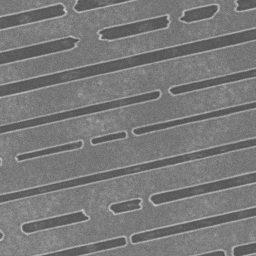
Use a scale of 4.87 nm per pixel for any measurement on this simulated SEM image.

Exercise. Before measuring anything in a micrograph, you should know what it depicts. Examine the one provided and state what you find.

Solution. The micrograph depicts parallel lines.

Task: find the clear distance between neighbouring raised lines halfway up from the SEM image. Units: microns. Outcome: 0.0434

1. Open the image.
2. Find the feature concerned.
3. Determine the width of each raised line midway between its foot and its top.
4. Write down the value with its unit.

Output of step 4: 120 nanometers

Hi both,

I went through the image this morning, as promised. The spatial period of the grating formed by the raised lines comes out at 167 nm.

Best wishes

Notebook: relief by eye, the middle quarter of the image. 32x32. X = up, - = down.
XXXXXX-------------XXXXXXXXXXXXX
X--------------XXXXXXXXXXXXXXXXX
----------XXXXXXXXXXXXXXXXXXXXXX
------XXXXXXXXXXXXXXXXXXXXXXXXXX
--XXXXXXXXXXXXXXXXXXXXXXXXXXXXXX
XXXXXXXXXXXXXXXXXXXXXXXXXXXX----
XXXXXXXXXXXXXXXXXXXXXXXXXX------
XXXXXXXXXXXXXXXXXXX-----XXX---XX
XXXXXXXXXXXXXXX---------XXXXXXXX
XXXXXXXXXX----------XXXXXXXXXXXX
XXXXXX---------XXXXXXXXXXXXXXXXX
X----------XXXXXXXXXXXXXXXXXXXXX
-------XXXXXXXXXXXXXXXXXXXXXXXXX
--XXXXXXXXXXXXXXXXXXXXXXXXXXXX--
XXXXXXXXXXXXXXXXXXXXXXXXX-------
XXXXXXXXXXXXXXXXXXXX--------XXXX
XXXXXXXXXXXXXXXXX--------XXXXXXX
XXXXXXXXXXX-----XX--XXXXXXXXXXXX
XXXXXXX--------XXXXXXXXXXXXXXXXX
XX---XX----XXXXXXXXXXXXXXXXXXXXX
-----XXXXXXXXXXXXXXXXXXXXXXXXXXX
--XXXXXXXXXXXXXXXXXXXXXXXXXXXXXX
XXXXXXXXXXXXXXXXXXXXXXXXXXXXXX--
XXXXXXXXXXXXXXXXXXXXXXXXXX------
XXXXXXXXXXXXXXXXXXXXX----------X
XXXXXXXXXXXXXXXXX---------XXXXXX
XXXXXXXXXXXX----------XXXXXXXXXX
XXXXXXX----------XXXXXXXXXXXXXXX
XX-----------XXXXXXXXXXXXXXXXXXX
--------XXXXXXXXXXXXXXXXXXXXXXXX
----XXXXXXXXXXXXXXXXXXXXXXXXXXXX
XXXXXXXXXXXXXXXXXXXXXXXXXXX-----